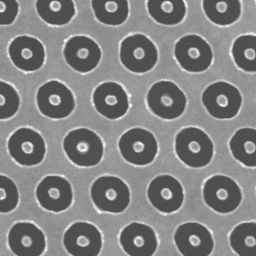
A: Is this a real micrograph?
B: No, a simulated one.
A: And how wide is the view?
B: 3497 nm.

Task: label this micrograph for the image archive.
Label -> a regular array of ring-shaped grooves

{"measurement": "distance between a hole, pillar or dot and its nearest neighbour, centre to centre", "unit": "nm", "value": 742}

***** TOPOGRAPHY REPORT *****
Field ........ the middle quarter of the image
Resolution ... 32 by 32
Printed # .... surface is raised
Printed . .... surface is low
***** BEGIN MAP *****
##......#######.......#######...
###....#########......#########.
################################
################################
########################...#####
#########.....########......####
.#######.......######........###
..#####.........#####.........##
..#####...###...#####....#....##
..#####....##...#####....##....#
...#####........#####.........##
..######........######........##
.########......########......###
###########...##########....####
################################
################################
###....#########....#########...
#.......#######.......######....
.........#####.........#####....
.........#####.........#####....
...###....####...###...#####...#
....##....####...###....####...#
#.........####.........#####....
#........######........######...
##.......#######......########..
####..#########################.
################################
################################
#########....##########.....####
.#######.......#######.......###
..#####.........#####........###
..#####....##...#####...##....##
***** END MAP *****